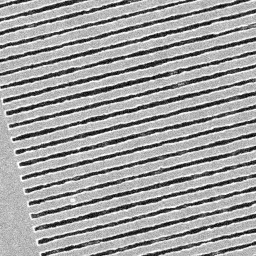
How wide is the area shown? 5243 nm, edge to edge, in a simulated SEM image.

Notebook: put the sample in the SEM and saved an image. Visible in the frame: parallel lines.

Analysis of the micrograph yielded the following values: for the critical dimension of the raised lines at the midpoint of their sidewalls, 0.179 um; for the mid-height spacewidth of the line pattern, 97 nm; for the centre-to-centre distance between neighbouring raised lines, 271 nm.